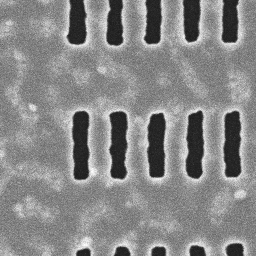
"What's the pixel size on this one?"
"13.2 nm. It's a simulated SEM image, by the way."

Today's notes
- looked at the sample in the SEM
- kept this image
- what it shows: holes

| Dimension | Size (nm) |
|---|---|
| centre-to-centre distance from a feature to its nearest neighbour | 498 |